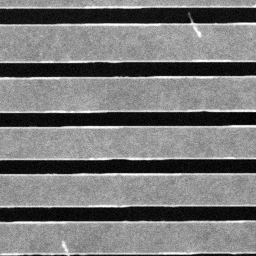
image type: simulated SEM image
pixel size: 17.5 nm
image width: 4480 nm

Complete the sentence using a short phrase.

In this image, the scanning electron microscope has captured lines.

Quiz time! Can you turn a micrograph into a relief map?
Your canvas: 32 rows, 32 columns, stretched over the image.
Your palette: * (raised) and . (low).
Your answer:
********************************
................................
................................
********************************
********************************
********************************
********************************
********************************
................................
...............................*
********************************
********************************
********************************
********************************
................................
................................
********************************
********************************
********************************
********************************
................................
................................
********************************
********************************
********************************
********************************
................................
................................
********************************
********************************
********************************
********************************